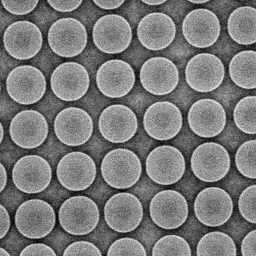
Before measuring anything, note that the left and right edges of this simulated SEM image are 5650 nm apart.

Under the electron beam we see an array of small figures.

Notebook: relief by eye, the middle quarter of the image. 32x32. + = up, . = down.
++++.....+++++++....++++++++...+
+++++....++++++++..+++++++++...+
++++++..+++++++++..+++++++++...+
++++++..+++++++++..+++++++++...+
++++++..+++++++++..+++++++++...+
++++++...++++++++...++++++++....
++++++...+++++++.....++++++.....
+++++.....+++++........++.......
++++............................
................................
............+++.......++++++....
++++......+++++++....++++++++...
++++++...++++++++...+++++++++..+
++++++...+++++++++..+++++++++..+
+++++++..+++++++++..+++++++++..+
+++++++..+++++++++..+++++++++...
+++++++..+++++++++...++++++++...
+++++++..++++++++....+++++++....
++++++....++++++.......++++.....
+++++.......++..................
................................
.............+++......++++++....
.++++......++++++.....+++++++...
+++++++...++++++++...+++++++++..
+++++++...+++++++++..+++++++++..
++++++++.++++++++++..+++++++++..
++++++++..+++++++++..+++++++++..
++++++++..+++++++++..+++++++++..
++++++++..+++++++++...+++++++...
+++++++....+++++++.....+++++....
++++++......+++++...............
..++............................